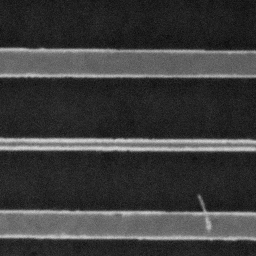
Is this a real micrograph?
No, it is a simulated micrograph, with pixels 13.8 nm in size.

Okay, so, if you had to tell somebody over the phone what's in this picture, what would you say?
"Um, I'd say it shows lines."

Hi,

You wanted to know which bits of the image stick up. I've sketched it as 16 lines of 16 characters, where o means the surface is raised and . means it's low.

................
................
................
oooooooooooooooo
oooooooooooooooo
................
................
................
................
................
................
................
................
oooooooooooooooo
oooooooooooooooo
................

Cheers